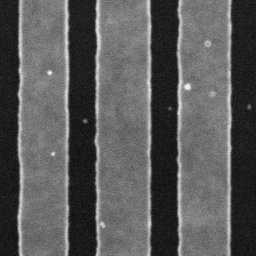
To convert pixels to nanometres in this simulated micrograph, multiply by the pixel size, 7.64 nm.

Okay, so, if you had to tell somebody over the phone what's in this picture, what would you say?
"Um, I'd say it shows lines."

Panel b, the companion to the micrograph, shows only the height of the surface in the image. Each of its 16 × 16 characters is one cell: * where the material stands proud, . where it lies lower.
.***..***..***..
.***..***..***..
.***..***..***..
.***..***..***..
.***..***..***..
.***..***..***..
.***..***..***..
.***..***..***..
.***..***..***..
.***..***..***..
.***..***..***..
.***..***..***..
.***..***..***..
.***..***..***..
.***..***..***..
.***..***..***..